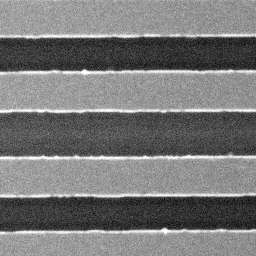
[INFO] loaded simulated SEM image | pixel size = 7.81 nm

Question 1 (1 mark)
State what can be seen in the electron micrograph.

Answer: lines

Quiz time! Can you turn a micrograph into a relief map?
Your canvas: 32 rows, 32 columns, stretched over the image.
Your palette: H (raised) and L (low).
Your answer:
HHHHHHHHHHHHHHHHHHHHHHHHHHHHHHHH
HHHHHHHHHHHHHHHHHHHHHHHHHHHHHHHH
HHHHHHHHHHHHHHHHHHHHHHHHHHHHHHHH
HHHHHHHHHHHHHHHHHHHHHHHHHHHHHHHH
HHHHHHHHHHHHHHHHHHLLLLLLHLLLLLLL
LLLLLLLLLLLLLLLLLLLLLLLLLLLLLLLL
LLLLLLLLLLLLLLLLLLLLLLLLLLLLLLLL
LLLLLLLLLLLLLLLLLLLLLLLLLLLLLLLL
LLLLLLLLLLLLLLLLLLLLLLLLLLLLLLLL
HHHHHHHHHHHHHHHHHHHHHHHHHHHHHHHH
HHHHHHHHHHHHHHHHHHHHHHHHHHHHHHHH
HHHHHHHHHHHHHHHHHHHHHHHHHHHHHHHH
HHHHHHHHHHHHHHHHHHHHHHHHHHHHHHHH
HHHHHHHHHHHHHHHHHHHHHHHHHHHHHHHH
LLLLLLLLLLLLLLLLLLLLLLLLLLLLLLLL
LLLLLLLLLLLLLLLLLLLLLLLLLLLLLLLL
LLLLLLLLLLLLLLLLLLLLLLLLLLLLLLLL
LLLLLLLLLLLLLLLLLLLLLLLLLLLLLLLL
LLLLLLLLLLLLLLLLLLLLLLLLLLLLLLLL
LLLLLLLLLLLLLLLLLLLLLLLLLLLLLLLL
HHHHHHHHHHHHHHHHHHHHHHHHHHHHHHHH
HHHHHHHHHHHHHHHHHHHHHHHHHHHHHHHH
HHHHHHHHHHHHHHHHHHHHHHHHHHHHHHHH
HHHHHHHHHHHHHHHHHHHHHHHHHHHHHHHH
HHHHHHHHLLLLHHHHLLLLLLLLLLLLLLLL
LLLLLLLLLLLLLLLLLLLLLLLLLLLLLLLL
LLLLLLLLLLLLLLLLLLLLLLLLLLLLLLLL
LLLLLLLLLLLLLLLLLLLLLLLLLLLLLLLL
LLLLLLLLLLLLLLLLLLLLLLLLLLLLLLLL
HHHHHHHHHHHHHHHHHHHHHHHHHHHHHHHH
HHHHHHHHHHHHHHHHHHHHHHHHHHHHHHHH
HHHHHHHHHHHHHHHHHHHHHHHHHHHHHHHH